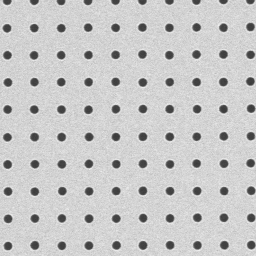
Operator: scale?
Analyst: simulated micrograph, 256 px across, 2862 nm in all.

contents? a regular array of holes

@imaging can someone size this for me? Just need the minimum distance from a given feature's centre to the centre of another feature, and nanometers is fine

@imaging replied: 299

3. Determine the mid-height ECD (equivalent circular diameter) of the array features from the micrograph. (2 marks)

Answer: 101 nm